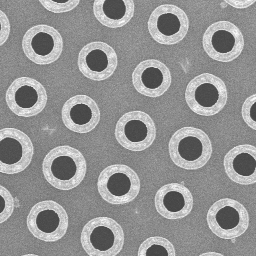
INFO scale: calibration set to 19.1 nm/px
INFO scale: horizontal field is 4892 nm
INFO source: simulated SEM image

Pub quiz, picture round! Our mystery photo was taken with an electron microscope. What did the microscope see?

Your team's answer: a regular array of ring-shaped raised bodies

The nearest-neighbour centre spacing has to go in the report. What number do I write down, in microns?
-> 1.06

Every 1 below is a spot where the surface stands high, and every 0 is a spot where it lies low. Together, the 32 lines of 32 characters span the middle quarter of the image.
00001100000110000011111110000000
00001110001110000011000011000000
00000111111100000110000001000000
00000011111000000110000001100000
00000000000000000111000011100001
00000000000000000011000011000001
00000000000000000011111111000011
00000000000000000000111110000011
00111110000000000000000000000011
11111111000000000000000000000001
11000011000000000000000000000001
11000001100000000000000000000000
11000001100000011111100000000000
11000001100000111111110000000000
11000011100001110000110000000000
11111111000001100000011000000000
00111110000001100000011000000111
00000000000001100000011000001111
00000000000001110000111000011100
00000000000000111011110000111000
10000000000000011111100000111000
11100000000000001111000000110000
11110000000000000000000000011000
00111000000000000000000000011100
00011000000000000000000000001111
00011000000111110000000000000111
00011000001111111000000000000000
00011000011110011100000000000000
00111000011000001110000000000000
11110000111000000110000000000000
11100000111000000110000001111100
00000000011000001110000011111110